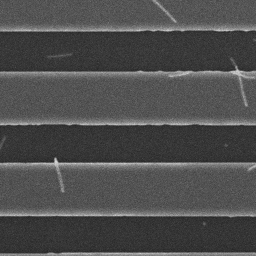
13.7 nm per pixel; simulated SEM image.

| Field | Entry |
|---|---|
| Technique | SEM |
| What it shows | lines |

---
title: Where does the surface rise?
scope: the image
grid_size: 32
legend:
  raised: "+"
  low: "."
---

++++++++++++++++++++++++++++++++
++++++++++++++++++++++++++++++++
++++++++++++++++++++++++++++++++
++++++++++++++++++++++++++++++++
................................
................................
................................
................................
................................
++++++++++++++++++++++++++++++++
++++++++++++++++++++++++++++++++
++++++++++++++++++++++++++++++++
++++++++++++++++++++++++++++++++
++++++++++++++++++++++++++++++++
++++++++++++++++++++++++++++++++
+++++...+.++++++++++++++.+++++++
................................
................................
................................
................................
++++++++++++++++++++++++++++++++
++++++++++++++++++++++++++++++++
++++++++++++++++++++++++++++++++
++++++++++++++++++++++++++++++++
++++++++++++++++++++++++++++++++
++++++++++++++++++++++++++++++++
++++++++++++++++++++++++++++++++
................................
................................
................................
................................
................................